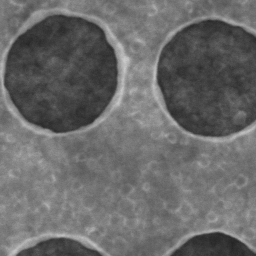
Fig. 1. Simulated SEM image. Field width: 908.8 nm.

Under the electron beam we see holes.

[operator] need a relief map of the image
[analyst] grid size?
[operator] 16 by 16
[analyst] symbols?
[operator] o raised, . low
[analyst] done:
oooooooooooooooo
oo....oooooo..oo
o......oooo.....
.......ooo......
........oo......
.......ooo......
o......ooo......
o.....ooooo.....
oooooooooooo...o
oooooooooooooooo
oooooooooooooooo
oooooooooooooooo
oooooooooooooooo
oooooooooooooooo
ooooooooooooo.oo
o.....ooooo.....